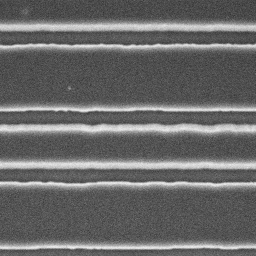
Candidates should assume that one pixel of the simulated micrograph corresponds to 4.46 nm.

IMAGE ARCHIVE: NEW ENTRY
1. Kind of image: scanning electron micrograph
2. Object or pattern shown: lines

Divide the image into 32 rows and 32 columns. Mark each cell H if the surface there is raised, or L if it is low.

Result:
HHHHHHHHHHHHHHHHHHHHHHHHHHHHHHHH
HHHHHHHHHHHHHHHHHHHHHHHHHHHHHHHH
HHHHHHHHHHHHHHHHHHHHHHHHHHHHHHHH
LLLLLLLLLLLLLLLLLLLLLLLLLHHLLHHH
LLLLLLLLLLLLLLLLLLLLLLLLLLLLLLLL
LLLLLLLLLLLLLLLLLLLLLLLLLLLLLLLL
HHHHHHHHHHHHHHHHHHHHHHHHHHHHHHHH
HHHHHHHHHHHHHHHHHHHHHHHHHHHHHHHH
HHHHHHHHHHHHHHHHHHHHHHHHHHHHHHHH
HHHHHHHHHHHHHHHHHHHHHHHHHHHHHHHH
HHHHHHHHHHHHHHHHHHHHHHHHHHHHHHHH
HHHHHHHHHHHHHHHHHHHHHHHHHHHHHHHH
HHHHHHHHHHHHHHHHHHHHHHHHHHHHHHHH
HHHHHHHHHHHHHHHHHHHHHHHHHHHHHHHH
LLLLLLLLLLLLLLLLLLLLLLLLLLLLLLLL
LLLLLLLLLLLLLLLLLLLLLLLLLLLLLLLL
HHHHHHHHHHHHHHHHHHHHHHHHHHHHHHHH
HHHHHHHHHHHHHHHHHHHHHHHHHHHHHHHH
HHHHHHHHHHHHHHHHHHHHHHHHHHHHHHHH
HHHHHHHHHHHHHHHHHHHHHHHHHHHHHHHH
HHHHHHHHHHHHHHHHHHHHHHHHHHHHHHHH
LLLLLLLLLLLLLLLLLLLLLLLLLLLLLLLL
LLLLLLLLLLLLLLLLLLLLLLLLLLLLLLLL
HHHHHHHHHHHHHHHHHHHHHHHHHHHHHHHH
HHHHHHHHHHHHHHHHHHHHHHHHHHHHHHHH
HHHHHHHHHHHHHHHHHHHHHHHHHHHHHHHH
HHHHHHHHHHHHHHHHHHHHHHHHHHHHHHHH
HHHHHHHHHHHHHHHHHHHHHHHHHHHHHHHH
HHHHHHHHHHHHHHHHHHHHHHHHHHHHHHHH
HHHHHHHHHHHHHHHHHHHHHHHHHHHHHHHH
HHHHHHHHHHHHHHHHHHHHHHHHHHHHHHHH
LLLLLLLLLLLLLLLLLLLLLLLLLLLLLLLL